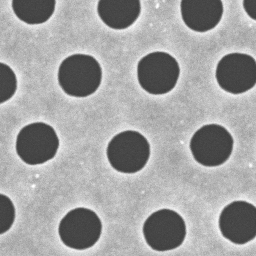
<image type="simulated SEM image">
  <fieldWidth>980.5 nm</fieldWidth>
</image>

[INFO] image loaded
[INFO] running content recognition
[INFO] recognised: holes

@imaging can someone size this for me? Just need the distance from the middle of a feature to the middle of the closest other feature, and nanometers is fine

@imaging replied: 320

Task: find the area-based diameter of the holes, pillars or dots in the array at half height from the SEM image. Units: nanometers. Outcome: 165